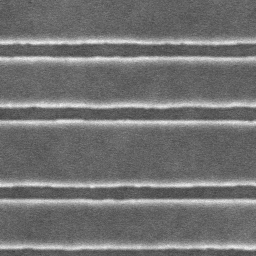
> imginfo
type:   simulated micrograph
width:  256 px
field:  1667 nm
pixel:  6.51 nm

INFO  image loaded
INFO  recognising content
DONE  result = lines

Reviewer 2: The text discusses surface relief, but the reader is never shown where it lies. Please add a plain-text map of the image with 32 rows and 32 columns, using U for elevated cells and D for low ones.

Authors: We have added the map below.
UUUUUUUUUUUUUUUUUUUUUUUUUUUUUUUU
UUUUUUUUUUUUUUUUUUUUUUUUUUUUUUUU
UUUUUUUUUUUUUUUUUUUUUUUUUUUUUUUU
UUUUUUUUUUUUUUUUUUUUUUUUUUUUUUUU
UUUUUUUUUUUUUUUUUUUUUUUUUUUUUUUU
DDDDDDDDDDDDDDDDDDDDDDDDDDDDDDDD
DDDDDDDDDDDDDDDDDDDDDDDDDDDDDDDD
UUUUUUUUUUUUUUUUUUUUUUUUUUUUUUUU
UUUUUUUUUUUUUUUUUUUUUUUUUUUUUUUU
UUUUUUUUUUUUUUUUUUUUUUUUUUUUUUUU
UUUUUUUUUUUUUUUUUUUUUUUUUUUUUUUU
UUUUUUUUUUUUUUUUUUUUUUUUUUUUUUUU
UUUUUUUUUUUUUUUUUUUUUUUUUUUUUUUU
DDDDDDDDDDDDDDDDDDDDDDDDDDDDDDDD
DDDDDDDDDDDDDDDDDDDDDDDDDDDDDDDD
UUUUUUUUUUUUUUUUUUUUUUUUUUUUUUUU
UUUUUUUUUUUUUUUUUUUUUUUUUUUUUUUU
UUUUUUUUUUUUUUUUUUUUUUUUUUUUUUUU
UUUUUUUUUUUUUUUUUUUUUUUUUUUUUUUU
UUUUUUUUUUUUUUUUUUUUUUUUUUUUUUUU
UUUUUUUUUUUUUUUUUUUUUUUUUUUUUUUU
UUUUUUUUUUUUUUUUUUUUUUUUUUUUUUUU
UUUUUUUUUUUUUUUUUUUUUUUUUUUUUUUU
DDDDDDDDDDDDDDDDDDDDDDDDDDDDDDDD
DDDDDDDDDDDDDDDDDDDDDDDDDDDDDDDD
UUUUUUUUUUUUUUUUUUUUUUUUUUUUUUUU
UUUUUUUUUUUUUUUUUUUUUUUUUUUUUUUU
UUUUUUUUUUUUUUUUUUUUUUUUUUUUUUUU
UUUUUUUUUUUUUUUUUUUUUUUUUUUUUUUU
UUUUUUUUUUUUUUUUUUUUUUUUUUUUUUUU
UUUUUUUUUUUUUUUUUUUUUUUUUUUUUUUU
DDDDDDDDDDDDDDDDDDDDDDDDDDDDDDDD